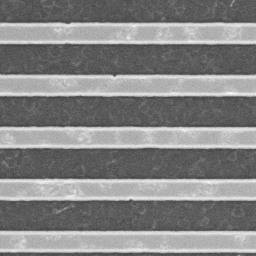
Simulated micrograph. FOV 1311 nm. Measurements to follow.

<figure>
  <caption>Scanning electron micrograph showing parallel lines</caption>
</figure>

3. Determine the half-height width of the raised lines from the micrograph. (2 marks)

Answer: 101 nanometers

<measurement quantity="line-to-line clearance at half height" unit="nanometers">165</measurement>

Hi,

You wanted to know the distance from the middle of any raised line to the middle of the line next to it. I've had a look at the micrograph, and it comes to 0.267 micrometres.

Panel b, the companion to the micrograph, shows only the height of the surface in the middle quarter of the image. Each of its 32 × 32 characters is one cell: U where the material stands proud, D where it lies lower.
DDDDDDDDDDDDDDDDDDDDDDDDDDDDDDDD
DDDDDDDDDDDDDDDDDDDDDDDDDDDDDDDD
DDDDDDDDDDDDDDDDDDDDDDDDDDDDDDDD
UUUUUUUUUUUUUUUUUUUUUUUUUUUUUUUU
UUUUUUUUUUUUUUUUUUUUUUUUUUUUUUUU
UUUUUUUUUUUUUUUUUUUUUUUUUUUUUUUU
UUUUUUUUUUUUUUUUUUUUUUUUUUUUUUUU
UUUUUUUUUUUUUUUUUUUUUUUUUUUUUUUU
DDDDDDDDDDDDDDDDDDDDDDDDDDDDDDDD
DDDDDDDDDDDDDDDDDDDDDDDDDDDDDDDD
DDDDDDDDDDDDDDDDDDDDDDDDDDDDDDDD
DDDDDDDDDDDDDDDDDDDDDDDDDDDDDDDD
DDDDDDDDDDDDDDDDDDDDDDDDDDDDDDDD
DDDDDDDDDDDDDDDDDDDDDDDDDDDDDDDD
DDDDDDDDDDDDDDDDDDDDDDDDDDDDDDDD
DDDDDDDDDDDDDDDDDDDDDDDDDDDDDDDD
UUUUUUUUUUUUUUUUUUUUUUUUUUUUUUUU
UUUUUUUUUUUUUUUUUUUUUUUUUUUUUUUU
UUUUUUUUUUUUUUUUUUUUUUUUUUUUUUUU
UUUUUUUUUUUUUUUUUUUUUUUUUUUUUUUU
UUUUUUUUUUUUUUUUUUUUUUUUUUUUUUUU
DDDDDDDDDDDDDDDDDDDDDDDDDDDDDDDD
DDDDDDDDDDDDDDDDDDDDDDDDDDDDDDDD
DDDDDDDDDDDDDDDDDDDDDDDDDDDDDDDD
DDDDDDDDDDDDDDDDDDDDDDDDDDDDDDDD
DDDDDDDDDDDDDDDDDDDDDDDDDDDDDDDD
DDDDDDDDDDDDDDDDDDDDDDDDDDDDDDDD
DDDDDDDDDDDDDDDDDDDDDDDDDDDDDDDD
DDDDDDDDDDDDDDDDDDDDDDDDDDDDDDDD
UUUUUUUUUUUUUUUUUUUUUUUUUUUUUUUU
UUUUUUUUUUUUUUUUUUUUUUUUUUUUUUUU
UUUUUUUUUUUUUUUUUUUUUUUUUUUUUUUU